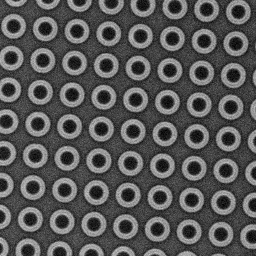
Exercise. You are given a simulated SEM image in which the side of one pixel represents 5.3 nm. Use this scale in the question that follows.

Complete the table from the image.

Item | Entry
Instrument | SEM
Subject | an array of small figures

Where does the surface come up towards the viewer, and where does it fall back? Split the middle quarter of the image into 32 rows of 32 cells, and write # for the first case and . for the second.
######..######..#####...#####...
#####...#####...######..#####...
.###....#####...#####...#####..#
.................###....#####...
..........................#.....
####.....##.....................
#####...####....####............
#####..######..######...####....
#####..######..######..######..#
####...######..######..######..#
.##.....####...######..######..#
................###.....####...#
................................
###.....###.....................
####...#####...####.............
####..######...#####...####.....
####..######..######..######...#
####...#####..######..######..##
###....####....#####..######..##
................###....####....#
...............................#
###....###......................
####..#####....####.............
####..######..#####...#####....#
####..######..######..#####...##
###...#####...######..######..##
#......####...#####...#####...##
...............###....#####...##
...............................#
##.....###......................
###...#####...####.....##.......
###..######..######...####....##